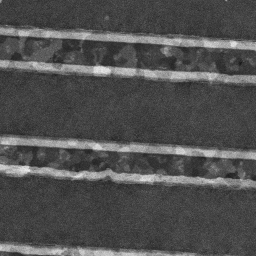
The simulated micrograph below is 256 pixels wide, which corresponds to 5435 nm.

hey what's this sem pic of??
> one or a few lines or trenches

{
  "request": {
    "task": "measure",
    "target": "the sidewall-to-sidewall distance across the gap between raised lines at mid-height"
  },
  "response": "1640 nanometers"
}